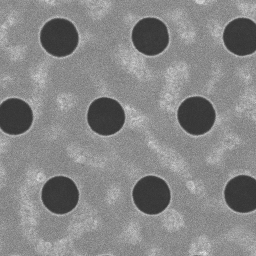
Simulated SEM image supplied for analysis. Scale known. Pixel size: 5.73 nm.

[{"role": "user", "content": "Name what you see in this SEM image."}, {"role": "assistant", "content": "holes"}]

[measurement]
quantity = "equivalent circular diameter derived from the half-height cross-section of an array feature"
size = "38.1 px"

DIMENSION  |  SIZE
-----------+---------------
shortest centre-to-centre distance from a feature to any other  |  0.521 µm